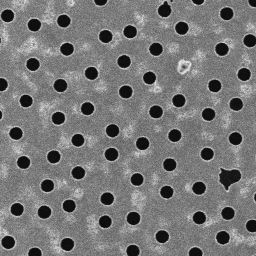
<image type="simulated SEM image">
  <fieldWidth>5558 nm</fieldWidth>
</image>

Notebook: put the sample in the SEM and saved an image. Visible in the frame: a regular array of holes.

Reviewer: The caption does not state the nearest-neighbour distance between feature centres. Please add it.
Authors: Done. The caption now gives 624 nm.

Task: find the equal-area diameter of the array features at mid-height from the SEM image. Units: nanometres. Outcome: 292